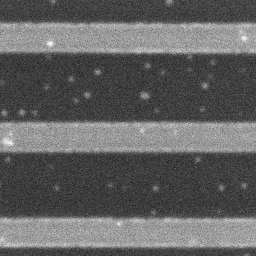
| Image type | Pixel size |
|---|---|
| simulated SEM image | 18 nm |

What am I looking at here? lines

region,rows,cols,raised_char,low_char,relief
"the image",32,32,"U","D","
UUUUUUUUUUUUUUUUUUUUUUUUUUUUUUUU
UUUUUUUUUUUUUUUUUUUUUUUUUUUUUUUU
UUUUUUUUUUUUUUUUUUUUUUUUUUUUUUUU
DDDDDDDDDDDDDDDDDDDDDDDDDDDDDDDD
DDDDDDDDDDDDDDDDDDDDDDDDDDDDDDDD
DDDDDDDDDDDDDDDDDDDDDDDDDDDDDDDD
UUUUUUUUUUUUUUUUUUUUUUUUUUUUUUDU
UUUUUUUUUUUUUUUUUUUUUUUUUUUUUUUU
UUUUUUUUUUUUUUUUUUUUUUUUUUUUUUUU
UUUUUUUUUUUUUUUUUUUUUUUUUUUUUUUU
UUUUUUUUUUUUUUUUUUUUUUUUUUUUUUUU
UUUUUUUUUUUUUUUUUUUUUUUUUUUUUUUU
UUUUUUUUUUUUUUUUUUUUUUUUUUUUUUUU
UUUUUUUUUUUUUUUUUUUUUUUUUUUUUUUU
UUUUUUUUUUUUUUUUUUUUUUUUUUUUUUUU
UUUDUUDDUUUUUUUUDDUUUUUUUUUUUUUU
DDDDDDDDDDDDDDDDDDDDDDDDDDDDDDDD
DDDDDDDDDDDDDDDDDDDDDDDDDDDDDDDD
DDDDDDDDDDDDDDDDDDDDDDDDDDDDDDDD
UUUUUUUUUUUUUUUUUUUUUUUUUUUUUUUU
UUUUUUUUUUUUUUUUUUUUUUUUUUUUUUUU
UUUUUUUUUUUUUUUUUUUUUUUUUUUUUUUU
UUUUUUUUUUUUUUUUUUUUUUUUUUUUUUUU
UUUUUUUUUUUUUUUUUUUUUUUUUUUUUUUU
UUUUUUUUUUUUUUUUUUUUUUUUUUUUUUUU
UUUUUUUUUUUUUUUUUUUUUUUUUUUUUUUU
UUUUUUUUUUUUUUUUUUUUUUUUUUUUUUUU
DDDDDDDDDDDDDDDDDDDDDDDDDDDDDDDD
DDDDDDDDDDDDDDDDDDDDDDDDDDDDDDDD
DDDDDDDDDDDDDDDDDDDDDDDDDDDDDDDD
DDDDDDDDDDDDDDDDDDDDDDDDDDDDDDDD
UUUUUUUUUUUUUUUUUUUUUUUUUUUUUUUU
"